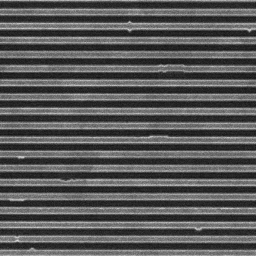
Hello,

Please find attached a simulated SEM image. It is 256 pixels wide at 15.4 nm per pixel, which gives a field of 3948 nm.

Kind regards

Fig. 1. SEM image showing parallel lines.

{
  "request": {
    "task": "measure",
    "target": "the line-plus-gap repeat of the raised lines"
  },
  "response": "219 nm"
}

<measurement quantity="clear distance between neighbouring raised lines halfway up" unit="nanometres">106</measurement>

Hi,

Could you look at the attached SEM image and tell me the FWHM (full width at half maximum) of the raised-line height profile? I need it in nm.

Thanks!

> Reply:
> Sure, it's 104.